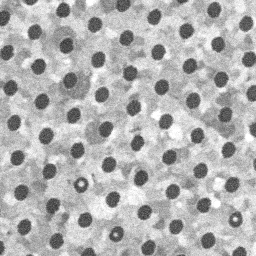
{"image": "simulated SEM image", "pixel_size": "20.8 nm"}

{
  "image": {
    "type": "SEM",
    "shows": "a regular array of holes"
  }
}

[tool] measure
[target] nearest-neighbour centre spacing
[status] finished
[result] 0.712 micrometres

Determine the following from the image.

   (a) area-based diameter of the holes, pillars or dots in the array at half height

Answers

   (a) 337 nanometres